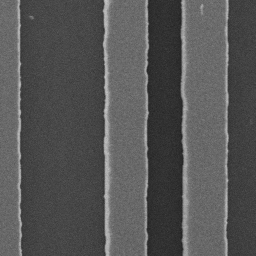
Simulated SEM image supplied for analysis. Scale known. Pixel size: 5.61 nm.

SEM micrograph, lines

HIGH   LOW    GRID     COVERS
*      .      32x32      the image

**...........*****.....*****....
**...........*****.....*****....
**...........******....*****....
***..........*****.....*****....
**...........*****.....*****....
**...........******....*****....
**...........*****.....*****....
***..........*****.....*****....
***..........*****.....*****....
***..........*****.....*****....
***..........*****.....*****....
***..........*****.....*****....
***..........*****.....*****....
***..........*****.....*****....
***..........******....*****....
***..........*****.....*****....
***..........*****.....*****....
**...........*****.....*****....
**...........*****.....*****....
***..........*****.....*****....
***..........*****.....*****....
***..........*****.....*****....
***..........*****.....*****....
***..........*****.....*****....
***..........*****.....*****....
***..........*****.....*****....
***..........*****.....*****....
***..........*****.....*****....
***..........*****.....*****....
***..........*****.....*****....
***..........*****.....*****....
***..........*****.....*****....